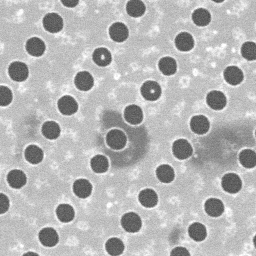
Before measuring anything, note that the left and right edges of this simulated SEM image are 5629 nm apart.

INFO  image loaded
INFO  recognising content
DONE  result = a regular array of holes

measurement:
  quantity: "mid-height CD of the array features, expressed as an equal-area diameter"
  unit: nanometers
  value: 470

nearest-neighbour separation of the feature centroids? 651 nm